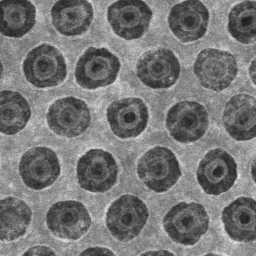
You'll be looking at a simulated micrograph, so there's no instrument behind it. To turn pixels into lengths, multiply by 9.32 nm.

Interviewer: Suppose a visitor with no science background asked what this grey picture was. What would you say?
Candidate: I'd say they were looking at a regular array of ring-shaped grooves with a dot in the middle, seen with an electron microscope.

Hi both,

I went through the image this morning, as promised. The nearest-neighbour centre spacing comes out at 526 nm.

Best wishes